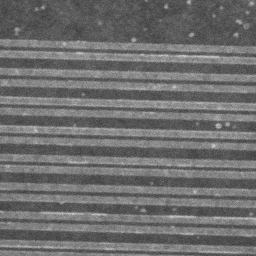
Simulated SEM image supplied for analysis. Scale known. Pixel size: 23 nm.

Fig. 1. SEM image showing parallel lines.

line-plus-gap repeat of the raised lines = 329 nm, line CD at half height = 147 nm